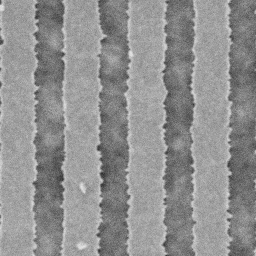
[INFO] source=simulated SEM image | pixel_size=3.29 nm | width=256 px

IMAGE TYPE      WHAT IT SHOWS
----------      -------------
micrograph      lines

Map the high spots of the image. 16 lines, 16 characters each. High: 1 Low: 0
1100110011001100
1100110011001100
1100110011001100
1100110011001100
1100110011001100
1100110011001100
1100110011001100
1100110011001100
1100110011001100
1100110011001100
1100110011001100
1100110011001100
1100110011001100
1100110011001100
1100110011001100
1100110011001100